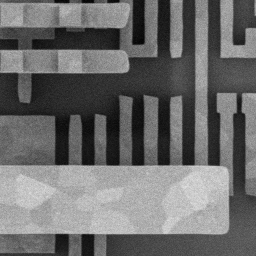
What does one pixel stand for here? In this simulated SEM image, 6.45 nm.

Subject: wiring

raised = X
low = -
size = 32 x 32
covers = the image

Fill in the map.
XXXXXXXXXXXXXXXX----------------
XXXXXXXXXXXXXXXX----------------
XXXXXXXXXXXXXXXX----------------
--------------------------------
--------------------------------
--------------------------------
XXXXXXXXXXXXXXXX----------------
XXXXXXXXXXXXXXXX----------------
XXXXXXXXXXXXXXXX----------------
--------------------------------
--------------------------------
--------------------------------
--------------------------------
--------------------------------
--------------------------------
--------------------------------
--------------------------------
--------------------------------
--------------------------------
--------------------------------
--------------------------------
XXXXXXXXXXXXXXXXXXXXXXXXXXXXX---
XXXXXXXXXXXXXXXXXXXXXXXXXXXXX---
XXXXXXXXXXXXXXXXXXXXXXXXXXXXX---
XXXXXXXXXXXXXXXXXXXXXXXXXXXXX---
XXXXXXXXXXXXXXXXXXXXXXXXXXXXX---
XXXXXXXXXXXXXXXXXXXXXXXXXXXXX---
XXXXXXXXXXXXXXXXXXXXXXXXXXXXX---
XXXXXXXXXXXXXXXXXXXXXXXXXXXXX---
--------------------------------
--------------------------------
--------------------------------